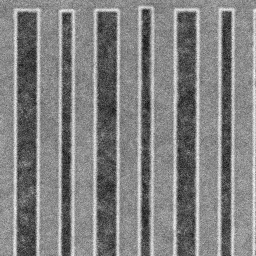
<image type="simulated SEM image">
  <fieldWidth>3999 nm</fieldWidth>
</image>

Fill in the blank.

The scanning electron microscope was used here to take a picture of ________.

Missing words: parallel lines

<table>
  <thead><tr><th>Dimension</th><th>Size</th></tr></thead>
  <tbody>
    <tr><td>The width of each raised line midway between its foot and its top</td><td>340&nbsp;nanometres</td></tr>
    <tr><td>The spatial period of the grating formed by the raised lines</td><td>608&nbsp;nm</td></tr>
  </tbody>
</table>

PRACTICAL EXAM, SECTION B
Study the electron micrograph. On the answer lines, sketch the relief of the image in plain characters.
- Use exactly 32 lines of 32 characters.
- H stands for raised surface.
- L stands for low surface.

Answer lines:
HHHHHHHHHHHHHHHHHHHHHHHHHHHHHHHH
HHLLLHHHLHHHLLLHHLLHHHLLLHHHLHHH
HHLLLHHLLHHHLLLHHLLHHHLLLHHLLHHH
HHLLLHHLLHHHLLLHHLLHHHLLLHHLLHHH
HHLLLHHLLHHHLLLHHLLHHHLLLHHLLHHH
HHLLLHHLLHHHLLLHHLLHHHLLLHHLLHHH
HHLLLHHLLHHHLLLHHLLHHHLLLHHLLHHH
HHLLLHHLLHHHLLLHHLLHHHLLLHHLLHHH
HHLLLHHLLHHHLLLHHLLHHHLLLHHLLHHH
HHLLLHHLLHHHLLLHHLLHHHLLLHHLLHHH
HHLLLHHLLHHHLLLHHLLHHHLLLHHLLHHH
HHLLLHHLLHHHLLLHHLLHHHLLLHHLLHHH
HHLLLHHLLHHHLLLHHLLHHHLLLHHLLHHH
HHLLLHHLLHHHLLLHHLLHHHLLLHHLLHHH
HHLLLHHLLHHHLLLHHLLHHHLLLHHLLHHH
HHLLLHHLLHHHLLLHHLLHHHLLLHHLLHHH
HHLLLHHLLHHHLLLHHLLHHHLLLHHLLHHH
HHLLLHHLLHHHLLLHHLLHHHLLLHHLLHHH
HHLLLHHLLHHHLLLHHLLHHHLLLHHLLHHH
HHLLLHHLLHHHLLLHHLLHHHLLLHHLLHHH
HHLLLHHLLHHHLLLHHLLHHHLLLHHLLHHH
HHLLLHHLLHHHLLLHHLLHHHLLLHHLLHHH
HHLLLHHLLHHHLLLHHLLHHHLLLHHLLHHH
HHLLLHHLLHHHLLLHHLLHHHLLLHHLLHHH
HHLLLHHLLHHHLLLHHLLHHHLLLHHLLHHH
HHLLLHHLLHHHLLLHHLLHHHLLLHHLLHHH
HHLLLHHLLHHHLLLHHLLHHHLLLHHLLHHH
HHLLLHHLLHHHLLLHHLLHHHLLLHHLLHHH
HHLLLHHLLHHHLLLHHLLHHHLLLHHLLHHH
HHLLLHHLLHHHLLLHHLLHHHLLLHHLLHHH
HHLLLHHLLHHHLLLHHLLHHHLLLHHLLHHH
HHLLLHHLLHHHLLLHHLLHHHLLLHHLLHHH